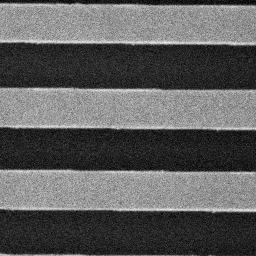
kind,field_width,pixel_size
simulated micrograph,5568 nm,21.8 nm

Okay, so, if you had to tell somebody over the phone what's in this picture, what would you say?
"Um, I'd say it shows lines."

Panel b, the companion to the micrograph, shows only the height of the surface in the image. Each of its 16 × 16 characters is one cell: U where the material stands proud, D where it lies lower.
UUUUUUUUUUUUUUUU
UUUUUUUUUUUUUUUU
UUUUUUUUUUUUUUUU
DDDDDDDDDDDDDDDD
DDDDDDDDDDDDDDDD
DDDDDDDDDDDDDDDD
UUUUUUUUUUUUUUUU
UUUUUUUUUUUUUUUU
DDDDDDDDDDDDDDDD
DDDDDDDDDDDDDDDD
DDDDDDDDDDDDDDDD
UUUUUUUUUUUUUUUU
UUUUUUUUUUUUUUUU
DDDDDDDDDDDDDDDD
DDDDDDDDDDDDDDDD
DDDDDDDDDDDDDDDD